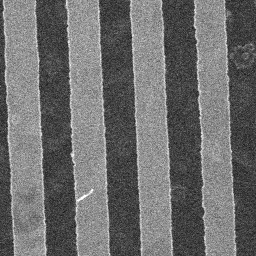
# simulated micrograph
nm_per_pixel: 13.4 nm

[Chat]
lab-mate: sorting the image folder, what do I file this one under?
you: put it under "one or a few lines or trenches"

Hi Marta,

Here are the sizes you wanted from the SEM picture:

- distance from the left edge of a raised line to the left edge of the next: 852 nm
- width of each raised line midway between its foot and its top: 418 nanometers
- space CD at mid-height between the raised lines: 433 nm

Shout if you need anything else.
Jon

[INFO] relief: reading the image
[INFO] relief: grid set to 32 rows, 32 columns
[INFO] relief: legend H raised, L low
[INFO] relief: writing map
HHHHLLLLHHHHLLLLHHHHLLLLHHHHLLLL
HHHHLLLLHHHHLLLLHHHHLLLLHHHHLLLL
LHHHLLLLLHHHLLLLHHHHLLLLHHHHLLLL
LHHHHLLLHHHHLLLLHHHHLLLLHHHHLLLL
LHHHHLLLLHHHLLLLLHHHLLLLHHHHLLLL
LHHHHLLLLHHHLLLLLHHHLLLLLHHHLLLL
LHHHHLLLLHHHHLLLLHHHLLLLLHHHLLHH
LHHHHLLLLHHHHLLLLHHHHLLLLHHHLHHH
LHHHHLLLLHHHHLLLLHHHHLLLLHHHLLLL
LHHHHLLLLHHHHLLLLHHHHLLLLHHHLLLL
LHHHHLLLLHHHHLLLLHHHHLLLLHHHHLLL
LHHHHLLLLHHHHLLLLHHHHLLLLHHHHLLL
LHHHHLLLLHHHHLLLLHHHHLLLLHHHHLLL
LHHHHLLLLHHHHLLLLHHHHLLLLHHHHLLL
LHHHHLLLLHHHHLLLLHHHHLLLLHHHHLLL
LHHHHLLLLHHHHLLLLHHHHLLLLHHHHLLL
LHHHHLLLLHHHHLLLLHHHHLLLLHHHHLLL
LHHHHLLLLHHHHLLLLHHHHLLLLHHHHLLL
LHHHHLLLLHHHHLLLLHHHHLLLLHHHHLLL
LHHHHLLLLHHHHLLLLHHHHLLLLHHHHLLL
LHHHHLLLLHHHHLLLLHHHHLLLLHHHHLLL
LHHHHLLLLHHHHLLLLHHHHLLLLHHHHLLL
LHHHHLLLLHHHHLLLLHHHHLLLLHHHHLLL
LHHHHLLLLHHHHLLLLHHHHLLLLHHHHLLL
LHHHHLLLLLHHHLLLLHHHHLLLLHHHHLLL
LLHHHLLLLLHHHLLLLLHHHLLLLHHHHLLL
LHHHHLLLLLHHHLLLLLHHHLLLLLHHHLLL
LLHHHHLLLHHHHHLLLLHHHLLLLHHHHLLL
LLHHHHLLLLHHHHLLLLHHHLLLLLHHHLLL
LLHHHHLLLLHHHHLLLLHHHLLLLLHHHLLL
LLHHHHLLLLHHHHLLLLHHHLLLLLHHHLLL
LLHHHHLLLLHHHHLLLLHHHHLLLLHHHLLL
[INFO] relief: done